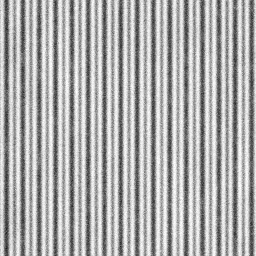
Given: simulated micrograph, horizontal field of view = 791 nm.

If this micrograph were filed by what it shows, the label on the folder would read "parallel lines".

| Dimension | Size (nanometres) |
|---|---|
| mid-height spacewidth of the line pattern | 19.3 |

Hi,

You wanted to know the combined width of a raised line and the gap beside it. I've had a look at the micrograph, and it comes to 25.1 nm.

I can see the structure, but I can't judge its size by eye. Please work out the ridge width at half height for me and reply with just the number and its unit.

8.5 nm